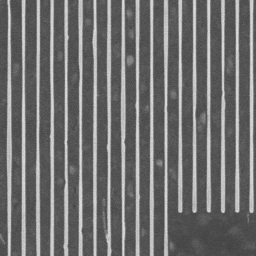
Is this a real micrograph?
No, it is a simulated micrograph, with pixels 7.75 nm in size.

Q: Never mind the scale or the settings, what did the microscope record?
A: parallel lines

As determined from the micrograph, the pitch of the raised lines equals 110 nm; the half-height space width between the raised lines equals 87.1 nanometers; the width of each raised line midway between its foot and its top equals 2.75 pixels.